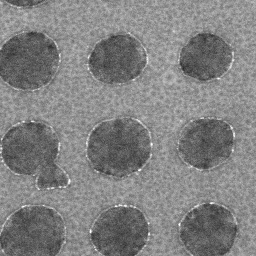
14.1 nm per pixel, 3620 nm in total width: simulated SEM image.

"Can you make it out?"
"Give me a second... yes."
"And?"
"raised bodies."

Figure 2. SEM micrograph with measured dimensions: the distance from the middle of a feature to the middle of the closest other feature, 1210 nm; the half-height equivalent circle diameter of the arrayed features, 770 nanometers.